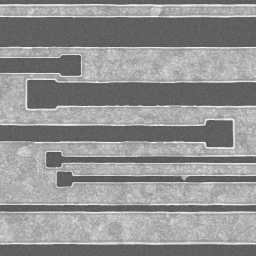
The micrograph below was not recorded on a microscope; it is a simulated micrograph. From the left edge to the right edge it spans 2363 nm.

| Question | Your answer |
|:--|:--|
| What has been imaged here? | groups of lines, slits or small figures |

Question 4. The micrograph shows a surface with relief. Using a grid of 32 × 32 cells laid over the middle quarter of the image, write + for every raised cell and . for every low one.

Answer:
.....+++++++++++++++++++++++++++
.....+++++++++++++++++++++++++++
.....+++++++++++++++++++++++++++
++++++++++++++++++++++++++++++++
.....++++++++......++++++++++..+
................................
................................
................................
................................
................................
................................
++++++++++++++++++++++++++++++++
++++++++++++++++++++++++++++++++
++++++++++++++++++++++++++++++++
++++++++++++++++++++++++++++++++
................................
................................
................................
................................
................................
++++++++++++++++++++++++++++++++
++++++++++++++++++++++++++++++++
++++++++++++++++++++++++++++++++
................................
................................
++++++++++++++++++++++++++++++++
++++++++++++++++++++++++++++++++
..++++++++++++++++++++++++++++++
................................
................................
..++++++++++++++++++++++++++++++
++++++++++++++++++++++++++++++++